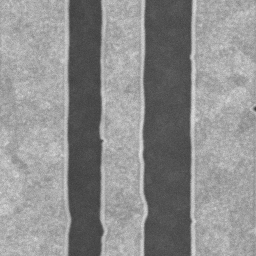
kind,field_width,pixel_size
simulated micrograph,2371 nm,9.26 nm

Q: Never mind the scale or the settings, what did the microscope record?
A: one or a few lines or trenches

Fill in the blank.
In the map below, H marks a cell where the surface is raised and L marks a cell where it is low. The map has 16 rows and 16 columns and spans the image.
HHHHLLHHHLLLHHHH
HHHHLLHHHLLLHHHH
HHHHLLHHHLLLHHHH
HHHHLLHHHLLLHHHH
HHHHLLHHHLLLHHHH
HHHHLLHHHLLLHHHH
HHHHLLHHHLLLHHHH
HHHHLLHHHLLLHHHH
HHHHLLHHHLLLHHHH
HHHHLLHHHLLLHHHH
HHHHLLHHHLLLHHHH
HHHHLLHHHLLLHHHH
HHHHLLHHHLLLHHHH
HHHHLLHHHLLLHHHH
HHHHLLLHHLLLHHHH
HHHHLLHHHLLLHHHH